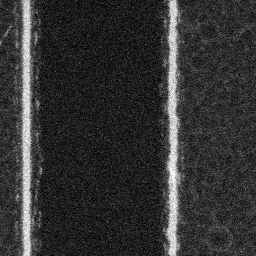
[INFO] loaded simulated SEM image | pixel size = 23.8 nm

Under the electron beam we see one or a few lines or trenches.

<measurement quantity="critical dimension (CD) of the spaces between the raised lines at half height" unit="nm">3490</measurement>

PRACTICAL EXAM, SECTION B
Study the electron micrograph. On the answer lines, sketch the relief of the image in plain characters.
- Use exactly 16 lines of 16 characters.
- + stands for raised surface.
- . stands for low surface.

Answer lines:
++.........+++++
++.........+++++
++.........+++++
++.........+++++
++.........+++++
++.........+++++
++.........+++++
++.........+++++
++.........+++++
++.........+++++
++.........+++++
++.........+++++
++.........+++++
++.........+++++
++.........+++++
++.........+++++